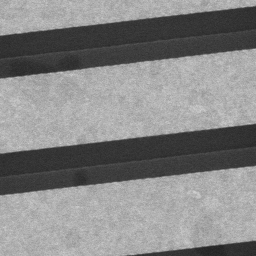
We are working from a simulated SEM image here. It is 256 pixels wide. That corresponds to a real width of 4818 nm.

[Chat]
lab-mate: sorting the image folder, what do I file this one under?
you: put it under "lines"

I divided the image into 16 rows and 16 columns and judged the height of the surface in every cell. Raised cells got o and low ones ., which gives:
ooooooooooooooo.
oooooo..........
................
............oooo
....oooooooooooo
oooooooooooooooo
oooooooooooooooo
oooooooooooooooo
ooooooooo.......
o...............
...............o
......oooooooooo
oooooooooooooooo
oooooooooooooooo
oooooooooooooooo
oooooooooooo....